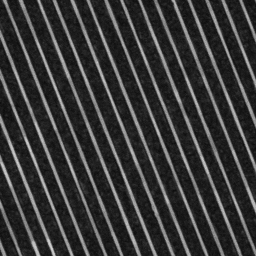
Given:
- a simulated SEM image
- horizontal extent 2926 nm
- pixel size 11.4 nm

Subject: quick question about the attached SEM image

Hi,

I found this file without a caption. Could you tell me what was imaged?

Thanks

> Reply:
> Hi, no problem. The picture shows parallel lines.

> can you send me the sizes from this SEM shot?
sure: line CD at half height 25.3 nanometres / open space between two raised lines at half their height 151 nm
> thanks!